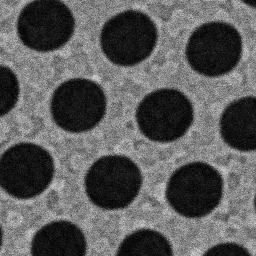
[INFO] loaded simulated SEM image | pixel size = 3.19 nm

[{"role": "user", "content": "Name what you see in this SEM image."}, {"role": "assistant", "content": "holes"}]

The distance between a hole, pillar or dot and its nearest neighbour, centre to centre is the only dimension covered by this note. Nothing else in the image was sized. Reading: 262 nanometres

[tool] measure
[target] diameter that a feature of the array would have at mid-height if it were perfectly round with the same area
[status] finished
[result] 182 nanometers